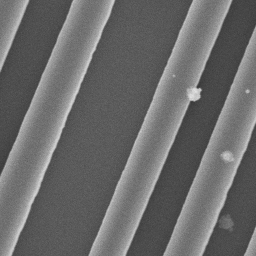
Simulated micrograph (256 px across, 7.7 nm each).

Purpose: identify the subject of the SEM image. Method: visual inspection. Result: lines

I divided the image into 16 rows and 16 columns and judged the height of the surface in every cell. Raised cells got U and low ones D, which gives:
UUDDUUUDDDDDUUDD
UDDDUUUDDDDUUUDD
UDDDUUDDDDDUUDDD
DDDUUUDDDDDUUDDU
DDDUUDDDDDUUUDDU
DDUUUDDDDDUUDDUU
DDUUUDDDDUUUDDUU
DUUUDDDDDUUDDDUU
DUUUDDDDDUUDDUUU
DUUDDDDDUUUDDUUD
UUUDDDDDUUDDUUUD
UUUDDDDUUUDDUUDD
UUDDDDDUUDDDUUDD
UUDDDDDUUDDUUUDD
UDDDDDUUDDDUUDDD
UDDDDDUUDDUUUDDU